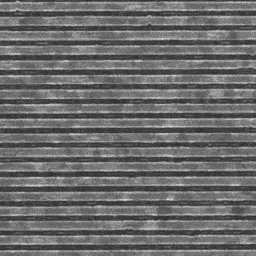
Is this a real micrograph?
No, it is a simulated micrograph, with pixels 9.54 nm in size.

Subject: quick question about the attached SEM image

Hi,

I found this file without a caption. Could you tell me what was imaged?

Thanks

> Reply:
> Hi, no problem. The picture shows parallel lines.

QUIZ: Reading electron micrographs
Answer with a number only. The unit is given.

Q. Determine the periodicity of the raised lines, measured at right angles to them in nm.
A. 139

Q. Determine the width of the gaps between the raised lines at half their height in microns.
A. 0.0584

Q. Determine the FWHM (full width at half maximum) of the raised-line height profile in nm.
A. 83.4